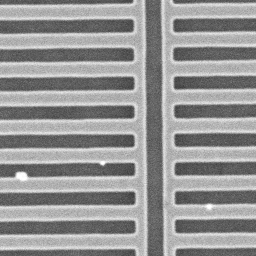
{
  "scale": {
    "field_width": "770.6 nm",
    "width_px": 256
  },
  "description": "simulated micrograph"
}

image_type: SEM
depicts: groups of lines, slits or small figures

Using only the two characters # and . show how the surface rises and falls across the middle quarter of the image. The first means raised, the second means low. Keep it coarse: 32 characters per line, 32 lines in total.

####################.....#######
####################.....#######
####################.....#######
..................##.....##.....
..................##.....##.....
..................##.....##.....
..................##.....###....
####################.....#######
####################.....#######
####################.....#######
.................###.....###....
..................##.....##.....
..................##.....##.....
.................###.....###....
####################.....#######
####################.....#######
####################.....#######
##........##########.....###....
..................##.....##.....
..................##.....##.....
..................##.....###....
####################.....#######
####################.....#######
####################.....#######
#........##......###.....###....
..................##.....##.....
..................##.....##.....
..................##.....###....
####################.....#######
####################.....#######
####################.....#######
####################.....#######